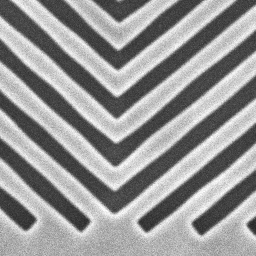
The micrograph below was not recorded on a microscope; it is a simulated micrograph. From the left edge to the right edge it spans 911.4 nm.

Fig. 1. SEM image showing groups of lines, slits or small figures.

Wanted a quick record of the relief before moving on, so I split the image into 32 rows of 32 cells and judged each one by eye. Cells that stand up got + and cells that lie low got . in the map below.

..+++....+++......++++...++++...
...+++....+++....+++....++++...+
....+++....+++..+++....++++...++
++...+++....++++++....+++....+++
+++...++++...++++...++++...++++.
.+++...++++...++...++++...++++..
..+++...++++......++++...++++...
...+++...++++...++++....+++....+
+...+++....+++.++++....+++....++
++...+++....++++++...++++...++++
+++...++++...++++...++++...++++.
++++...++++...++...+++....++++..
.++++...++++......+++....+++....
...+++...++++...++++...++++....+
+...+++...++++.++++...++++...+++
++...+++....++++++...++++...++++
+++...++++...++++...+++....++++.
++++...++++...+...++++....+++...
..+++...++++.....++++....+++...+
...+++...++++...++++...++++...++
+...+++...++++.+++....++++...+++
++...+++....+++++....+++....+++.
+++...++++...+++....+++....+++..
++++...++++...+....+++...++++...
..+++...++++.....++++...++++...+
...+++...++++...++++...++++...++
....+++...++++.+++....++++...+++
+....+++...++++++....+++....+++.
+++.+++++..+++++++.+++++..+++++.
++++++++++++++++++++++++++++++++
++++++++++++++++++++++++++++++++
++++++++++++++++++++++++++++++++